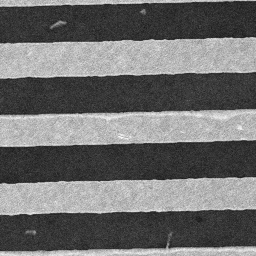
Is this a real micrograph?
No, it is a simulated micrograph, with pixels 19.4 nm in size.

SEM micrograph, lines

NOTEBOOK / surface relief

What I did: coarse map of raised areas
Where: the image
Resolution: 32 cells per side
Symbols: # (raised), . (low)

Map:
#############...................
................................
................................
................................
................................
################################
################################
################################
################################
#############...................
................................
................................
................................
................................
.....###########################
################################
################################
#############################...
................................
................................
................................
................................
...................#############
################################
################################
################################
##############..................
................................
................................
................................
................................
........###..###################